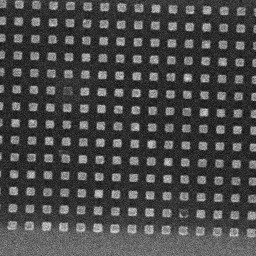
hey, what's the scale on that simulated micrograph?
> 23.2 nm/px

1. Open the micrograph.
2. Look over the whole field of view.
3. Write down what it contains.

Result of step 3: a regular array of raised bodies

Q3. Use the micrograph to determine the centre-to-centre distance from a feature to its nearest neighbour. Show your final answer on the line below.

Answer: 391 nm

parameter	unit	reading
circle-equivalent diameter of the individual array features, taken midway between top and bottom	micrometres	0.2